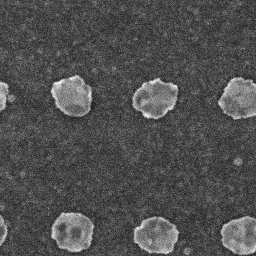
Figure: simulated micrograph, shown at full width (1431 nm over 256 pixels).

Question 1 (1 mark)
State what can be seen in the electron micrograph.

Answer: raised bodies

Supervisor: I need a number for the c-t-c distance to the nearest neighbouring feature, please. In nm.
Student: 465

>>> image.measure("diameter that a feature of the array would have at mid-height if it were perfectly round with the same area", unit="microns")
0.222